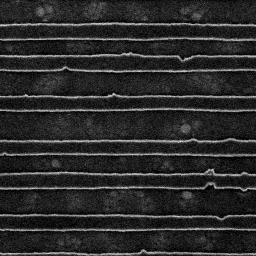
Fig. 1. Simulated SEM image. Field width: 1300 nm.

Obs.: parallel lines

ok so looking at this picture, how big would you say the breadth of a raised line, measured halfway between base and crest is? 74.3 nm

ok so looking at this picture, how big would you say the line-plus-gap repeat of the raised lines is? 194 nanometers